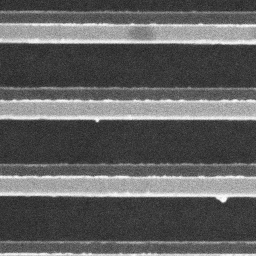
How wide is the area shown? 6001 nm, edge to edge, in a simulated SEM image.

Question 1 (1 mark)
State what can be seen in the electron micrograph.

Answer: lines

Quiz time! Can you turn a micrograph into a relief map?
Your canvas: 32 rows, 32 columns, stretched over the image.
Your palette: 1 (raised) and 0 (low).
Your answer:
00000000000000000000000000000000
00010000000000000000000000000000
11111111111111111111111111111111
11111111111111111111111111111111
11111111111111111111111111111111
00000000000000000000000000000000
00000000000000000000000000000000
00000000000000000000000000000000
00000000000000000000000000000000
00000000000000000000000000000000
00000000000000000000000000000000
11111111111111111111111111111111
11111111111111111111111111111111
11111111111111111111111111111111
11111111111111111111111111111111
00000000000000000000000000000000
00000000000000000000000000000000
00000000000000000000000000000000
00000000000000000000000000000000
00000000000000000000000000000000
00000000000000000000000000000010
11111111111111111111111111111111
11111111111111111111111111111111
11111111111111111111111111111111
00000010001111111111111111111111
00000000000000000000000000000000
00000000000000000000000000000000
00000000000000000000000000000000
00000000000000000000000000000000
00000000000000000000000000000000
11111111111111111111111111111111
11111111111111111111111111111111